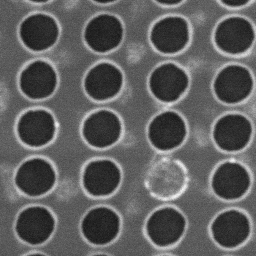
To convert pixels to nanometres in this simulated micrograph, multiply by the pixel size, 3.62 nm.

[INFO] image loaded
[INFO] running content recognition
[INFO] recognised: a regular array of holes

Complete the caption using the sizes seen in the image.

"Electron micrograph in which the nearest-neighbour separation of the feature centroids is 174 nanometers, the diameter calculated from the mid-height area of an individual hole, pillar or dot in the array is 0.143 µm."